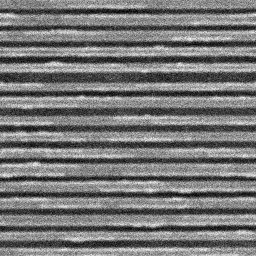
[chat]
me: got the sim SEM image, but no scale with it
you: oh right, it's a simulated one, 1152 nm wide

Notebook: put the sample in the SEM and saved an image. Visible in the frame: parallel lines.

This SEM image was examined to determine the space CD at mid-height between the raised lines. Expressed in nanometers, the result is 34.8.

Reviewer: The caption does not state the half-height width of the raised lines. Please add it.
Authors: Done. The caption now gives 39.3 nm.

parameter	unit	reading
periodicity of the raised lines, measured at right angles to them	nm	74.8